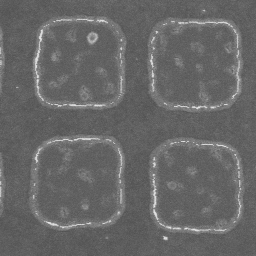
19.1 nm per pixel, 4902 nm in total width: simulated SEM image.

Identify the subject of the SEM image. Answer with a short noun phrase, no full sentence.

raised bodies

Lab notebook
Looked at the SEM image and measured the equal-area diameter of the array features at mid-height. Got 1.84 micrometres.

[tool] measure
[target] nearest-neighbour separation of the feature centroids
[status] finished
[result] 2240 nm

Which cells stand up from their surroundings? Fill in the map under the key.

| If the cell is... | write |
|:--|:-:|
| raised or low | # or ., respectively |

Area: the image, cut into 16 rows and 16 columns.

................
...####...####..
..######..#####.
..######.######.
..######..#####.
..######..#####.
...####...####..
................
................
..#####...#####.
..######..#####.
..######..#####.
..######..#####.
..#####...#####.
................
................